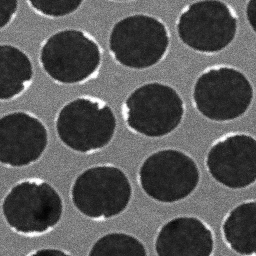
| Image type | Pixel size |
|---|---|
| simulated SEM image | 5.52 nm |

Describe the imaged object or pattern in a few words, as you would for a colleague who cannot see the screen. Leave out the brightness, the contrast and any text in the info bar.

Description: a regular array of holes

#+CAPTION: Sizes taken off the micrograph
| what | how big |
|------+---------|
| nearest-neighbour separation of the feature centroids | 68.6 pixels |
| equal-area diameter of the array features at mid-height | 0.303 micrometres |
